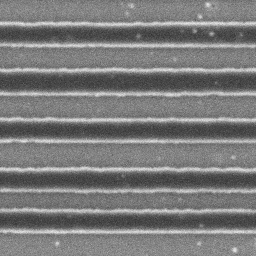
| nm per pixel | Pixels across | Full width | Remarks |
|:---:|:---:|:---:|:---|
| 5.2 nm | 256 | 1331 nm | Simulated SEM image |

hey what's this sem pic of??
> lines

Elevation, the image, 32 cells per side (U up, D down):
DDDDDDDDDDDDDDDDDDDDDDDDDDDDDDDD
DDDDDDDDDDDDDDDDDDDDDDDDDDDDDDDD
DDDDDDDDDDDDDDDDDDDDDDDDDDDDDDDD
UUUUUUUUUUUUUUUUUUUUUUUUUUUUUUUU
UUUUUUUUUUUUUUUUUUUUUUUUUUUUUUUU
UUUUUUUUUUUUUUUUUUUUUUUUUUUUUUUU
DDDDDDDDDDDDDDDDDDDDDDDDDDDDDDDD
DDDDDDDDDDDDDDDDDDDDDDDDDDDDDDDD
DDDDDDDDDDDDDDDDDDDDDDDDDDDDDDDD
UUUUUUUUUUUUUUUUUUUUUUUUUUUUUUUU
UUUUUUUUUUUUUUUUUUUUUUUUUUUUUUUU
UUUUUUUUUUUUUUUUUUUUUUUUUUUUUUUU
DDDDDDDDDDDDDDDDDDDDDDDDDDDDDDDD
DDDDDDDDDDDDDDDDDDDDDDDDDDDDDDDD
DDDDDDDDDDDDDDDDDDDDDDDDDDDDDDDD
UUUUUUUUUUUUUUUUUUUUUUUUUUUUUUUU
UUUUUUUUUUUUUUUUUUUUUUUUUUUUUUUU
UUUUUUUUUUUUUUUUUUUUUUUUUUUUUUUU
DDDDDDDDDDDDDDDDDDDDDDDDDDDDDDDD
DDDDDDDDDDDDDDDDDDDDDDDDDDDDDDDD
DDDDDDDDDDDDDDDDDDDDDDDDDDDDDDDD
UUUUUUUUUUUUUUUUUUUUUUUUUUUUUUUU
UUUUUUUUUUUUUUUUUUUUUUUUUUUUUUUU
UUUUUUUUUUUUUUUUUUUUUUUUUUUUUUUU
DDDDDDDDDDDDDDDDDDDDDDDDDDDDDDDD
DDDDDDDDDDDDDDDDDDDDDDDDDDDDDDDD
UUUUUUUUUUUUUUUUUUUUUUUUUUUUUUUU
UUUUUUUUUUUUUUUUUUUUUUUUUUUUUUUU
UUUUUUUUUUUUUUUUUUUUUUUUUUUUUUUU
DDDDDDDDDDDDDDDDDDDDDDDDDDDDDDDD
DDDDDDDDDDDDDDDDDDDDDDDDDDDDDDDD
DDDDDDDDDDDDDDDDDDDDDDDDDDDDDDDD